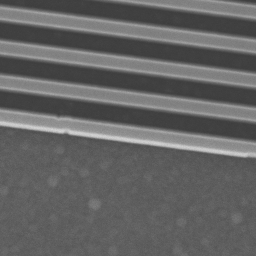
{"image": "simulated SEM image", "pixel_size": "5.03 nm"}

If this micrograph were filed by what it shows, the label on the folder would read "parallel lines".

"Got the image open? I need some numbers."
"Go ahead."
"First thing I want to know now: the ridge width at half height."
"76 nm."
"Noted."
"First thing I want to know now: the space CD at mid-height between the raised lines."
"0.0941 um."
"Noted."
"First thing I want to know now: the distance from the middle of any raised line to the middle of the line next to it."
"171 nm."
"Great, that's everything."